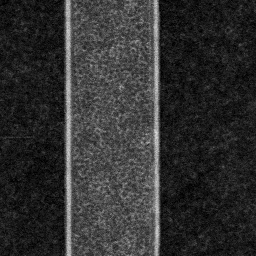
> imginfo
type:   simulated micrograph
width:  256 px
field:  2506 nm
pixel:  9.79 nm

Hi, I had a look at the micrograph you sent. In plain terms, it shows one or a few lines or trenches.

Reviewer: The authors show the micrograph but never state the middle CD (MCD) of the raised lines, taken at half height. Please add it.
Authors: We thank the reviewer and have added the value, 863 nm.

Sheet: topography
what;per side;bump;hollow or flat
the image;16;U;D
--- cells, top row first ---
DDDDUUUUUUDDDDDD
DDDDUUUUUUDDDDDD
DDDDUUUUUUDDDDDD
DDDDUUUUUUDDDDDD
DDDDUUUUUUDDDDDD
DDDDUUUUUUDDDDDD
DDDDUUUUUUDDDDDD
DDDDUUUUUUDDDDDD
DDDDUUUUUUDDDDDD
DDDDUUUUUUDDDDDD
DDDDUUUUUUDDDDDD
DDDDUUUUUUDDDDDD
DDDDUUUUUUDDDDDD
DDDDUUUUUUDDDDDD
DDDDUUUUUUDDDDDD
DDDDUUUUUUDDDDDD